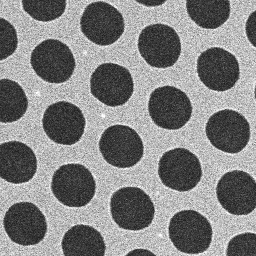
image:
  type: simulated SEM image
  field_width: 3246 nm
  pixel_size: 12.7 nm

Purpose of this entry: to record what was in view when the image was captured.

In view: a regular array of holes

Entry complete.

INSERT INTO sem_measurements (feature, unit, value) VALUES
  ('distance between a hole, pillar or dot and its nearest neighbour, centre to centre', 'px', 61.8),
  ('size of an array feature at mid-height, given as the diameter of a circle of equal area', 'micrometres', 0.562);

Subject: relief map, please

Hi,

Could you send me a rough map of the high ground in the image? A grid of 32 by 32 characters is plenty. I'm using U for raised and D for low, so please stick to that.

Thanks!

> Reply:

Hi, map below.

UUUDDDDDUUUDDDUUUUDDUUUDDDDDDUUU
UUUDDDDDUUDDDDDUUUUUUUUDDDDDDUUU
DUUUDDDUUUDDDDDUUUUUUUUUDDDDUUUD
DDUUUUUUUUDDDDDDUUDDDDUUUDDUUUUD
DDUUUUUUUUUDDDDUUDDDDDUUUUUUUUUD
DDUUUDDDUUUUDDUUUDDDDDDUUUUUUUUU
DDUUDDDDDUUUUUUUUDDDDDDUUDDDDUUU
UUUUDDDDDUUUUUUUUUDDDDUUUDDDDDUU
UUUUDDDDDUUUDDDDUUUUDUUUUDDDDDUU
UUUUUDDDDUUDDDDDUUUUUUUUUDDDDDUU
DDUUUUUUUUUDDDDDDUUUUUUUUDDDDUUU
DDDUUUUUUUUDDDDDDUUDDDDUUUUUUUUU
DDDUUUUUUUUUDDDDUUUDDDDDUUUUUUUU
DDDUUUDDDDUUUUUUUUDDDDDDUUUUUUUU
DDDUUDDDDDUUUUUUUUUDDDDDUUDDDDUU
UUUUUDDDDDDUUUUUUUUDDDDUUUDDDDDU
UUUUUUDDDDUUUDDDDUUUUUUUUUDDDDDU
UUUUUUDDDDUUDDDDDDUUUUUUUUDDDDDU
DDDDUUUUUUUUDDDDDDUUUUDUUUUDDDDU
DDDDUUUUUUUUUDDDDDUUDDDDUUUUUUUU
DDDDDUUUDDUUUUDDDUUUDDDDDUUUUUUU
DDDDUUUDDDDUUUUUUUUUDDDDDUUUDDDU
UDDDUUDDDDDDUUUUUUUUDDDDDUUDDDDD
UUUUUUDDDDDDUUUDDUUUUDDDUUUDDDDD
UUUUUUUDDDDDUUDDDDDUUUUUUUUDDDDD
UUDDUUUUDDDUUUDDDDDUUUUUUUUUDDDD
UDDDDUUUUUUUUUDDDDDUUUDDDUUUUDDU
DDDDDDUUUUUUUUDDDDDUUDDDDDUUUUUU
DDDDDDUUUDDDUUUDDDUUUDDDDDUUUUUU
UDDDDDUUDDDDDUUUUUUUUDDDDDDUUDDD
UUDDDUUUDDDDDUUUUUUUUUDDDDUUDDDD
UUUUUUUUDDDDDUUUDDDUUUUDDUUUDDDD